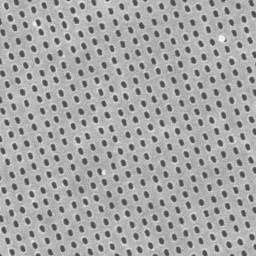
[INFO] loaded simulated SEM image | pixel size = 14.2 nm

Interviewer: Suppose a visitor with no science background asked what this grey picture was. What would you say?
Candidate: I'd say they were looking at a regular array of holes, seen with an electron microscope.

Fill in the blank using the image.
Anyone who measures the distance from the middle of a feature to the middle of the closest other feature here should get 161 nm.